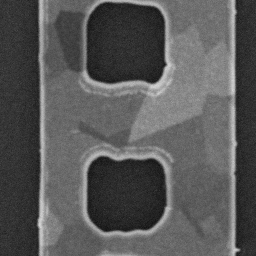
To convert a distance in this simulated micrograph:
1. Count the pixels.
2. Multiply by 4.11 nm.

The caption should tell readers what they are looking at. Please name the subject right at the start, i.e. one or a few lines or trenches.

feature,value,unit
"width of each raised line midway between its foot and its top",252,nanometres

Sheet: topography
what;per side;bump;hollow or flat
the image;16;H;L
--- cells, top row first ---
LLLHHHLLLLHHHHHL
LLLHHLLLLLHHHHHL
LLLHHLLLLLHHHHHL
LLLHHLLLLLHHHHHL
LLLHHLLLLLHHHHHL
LLLHHHHHHHHHHHHL
LLLHHHHHHHHHHHHL
LLLHHHHHHHHHHHHL
LLLHHHHHHHHHHHHL
LLLHHHHHHHHHHHHL
LLLHHLLLLLHHHHHL
LLLHHLLLLLLHHHHL
LLLHHLLLLLLHHHHL
LLLHHLLLLLHHHHHL
LLLHHHLLLHHHHHHL
LLLHHHHHHHHHHHHL